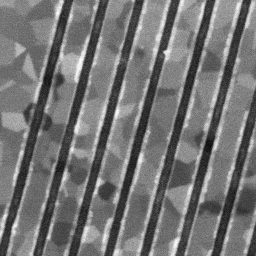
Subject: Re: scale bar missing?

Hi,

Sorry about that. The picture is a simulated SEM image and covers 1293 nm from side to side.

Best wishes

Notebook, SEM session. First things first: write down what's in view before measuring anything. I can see parallel lines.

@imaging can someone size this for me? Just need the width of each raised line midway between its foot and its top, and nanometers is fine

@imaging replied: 125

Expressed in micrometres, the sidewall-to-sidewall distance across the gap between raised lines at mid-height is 0.0483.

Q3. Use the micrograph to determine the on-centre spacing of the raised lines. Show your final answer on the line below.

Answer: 174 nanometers